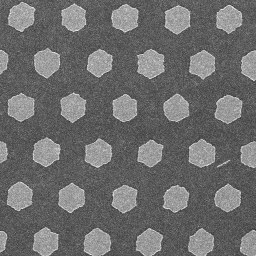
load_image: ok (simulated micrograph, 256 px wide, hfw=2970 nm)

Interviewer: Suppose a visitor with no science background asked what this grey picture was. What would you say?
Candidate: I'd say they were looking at a regular array of raised bodies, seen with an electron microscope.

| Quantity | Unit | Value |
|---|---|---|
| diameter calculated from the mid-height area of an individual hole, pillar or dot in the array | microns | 0.302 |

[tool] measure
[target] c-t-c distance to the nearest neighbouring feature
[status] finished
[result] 0.596 µm